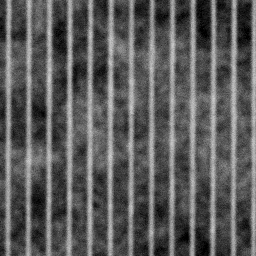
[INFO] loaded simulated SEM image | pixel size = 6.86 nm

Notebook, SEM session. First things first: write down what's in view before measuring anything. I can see parallel lines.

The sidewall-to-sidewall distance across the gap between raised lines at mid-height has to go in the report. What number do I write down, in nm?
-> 114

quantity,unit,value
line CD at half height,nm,25.7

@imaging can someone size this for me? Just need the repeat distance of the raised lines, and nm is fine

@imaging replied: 141